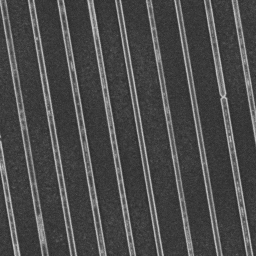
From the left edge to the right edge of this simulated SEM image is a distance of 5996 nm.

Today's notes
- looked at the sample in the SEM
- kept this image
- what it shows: parallel lines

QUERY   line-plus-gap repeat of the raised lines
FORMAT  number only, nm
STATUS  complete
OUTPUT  671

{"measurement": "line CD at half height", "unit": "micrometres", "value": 0.113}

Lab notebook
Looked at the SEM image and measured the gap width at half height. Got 543 nanometers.